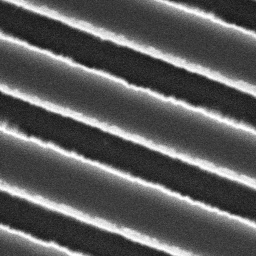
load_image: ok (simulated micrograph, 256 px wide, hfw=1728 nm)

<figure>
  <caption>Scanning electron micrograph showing lines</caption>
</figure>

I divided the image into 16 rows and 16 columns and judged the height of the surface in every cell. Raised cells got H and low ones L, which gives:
LLHHHHHHHHHLLLLL
LLLLHHHHHHHHHHLL
HLLLLLLHHHHHHHHH
HHHLLLLLLLHHHHHH
HHHHHHLLLLLLHHHH
HHHHHHHHLLLLLLLH
LLHHHHHHHHHLLLLL
LLLLLHHHHHHHHHLL
HLLLLLLLHHHHHHHH
HHHHLLLLLLHHHHHH
HHHHHHHLLLLLLHHH
HHHHHHHHHLLLLLLL
LLHHHHHHHHHHLLLL
LLLLLHHHHHHHHHLL
HLLLLLLHHHHHHHHH
HHHHLLLLLLHHHHHH